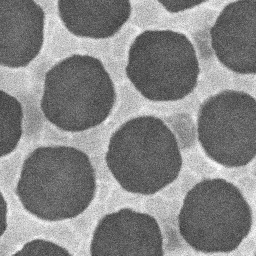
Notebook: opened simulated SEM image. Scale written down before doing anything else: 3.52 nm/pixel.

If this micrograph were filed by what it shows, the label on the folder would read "holes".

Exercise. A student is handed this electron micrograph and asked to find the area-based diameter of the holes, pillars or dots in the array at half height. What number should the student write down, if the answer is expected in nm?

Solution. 263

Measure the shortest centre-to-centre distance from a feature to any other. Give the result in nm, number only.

319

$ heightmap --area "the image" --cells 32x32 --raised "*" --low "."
.....**.........****.....****...
.....**.........*****.******....
.....***........***********.....
.....***.......***********......
.....*****....***......***......
.....************.......**......
.....***********........***.....
....****....****.........**.....
******.......***.........****...
******........**.........*******
******........***........*******
.****.........***.......****...*
..***.........*****...****......
...**.........***********.......
...***.......*****.******.......
...****.....****.....****.......
...************......****.......
..************........***.......
..***....*****........***.......
****.......**..........***......
***........**..........****....*
***.........**........**********
**..........***.......***...****
**..........***.....****......**
**..........***********.......**
.**........************........*
.***......*****..*****.........*
.*****..*****......***.........*
.***********........**.........*
************........***........*
***....****.........****......**
**.......**.........******...***